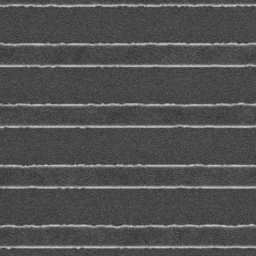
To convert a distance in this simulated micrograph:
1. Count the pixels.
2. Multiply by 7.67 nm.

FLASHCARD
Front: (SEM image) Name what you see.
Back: lines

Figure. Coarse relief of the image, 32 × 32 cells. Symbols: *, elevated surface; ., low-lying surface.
********************************
................................
................................
................................
................................
*......**...*...********..****.*
********************************
********************************
................................
................................
................................
................................
................................
********************************
********************************
********************************
................................
................................
................................
................................
................................
********************************
********************************
*......***..............*.......
................................
................................
................................
................................
********************************
********************************
********************************
................................